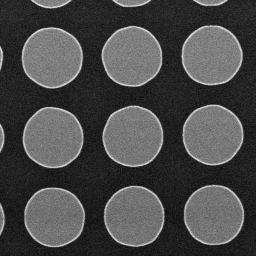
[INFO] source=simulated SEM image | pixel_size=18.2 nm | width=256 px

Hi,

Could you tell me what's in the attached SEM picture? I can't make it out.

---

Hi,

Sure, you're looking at an array of small figures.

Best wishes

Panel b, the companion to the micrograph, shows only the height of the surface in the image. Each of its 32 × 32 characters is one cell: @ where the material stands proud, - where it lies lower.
-----@@@-------@@@-------@@@----
--------------------------------
--------------------------------
------@---------@@-------@@@----
----@@@@@-----@@@@@-----@@@@@---
---@@@@@@@---@@@@@@@---@@@@@@@--
---@@@@@@@---@@@@@@@---@@@@@@@--
---@@@@@@@---@@@@@@@---@@@@@@@--
---@@@@@@@---@@@@@@@---@@@@@@@--
----@@@@@-----@@@@@-----@@@@@---
-----@@@-------@@@-------@@-----
--------------------------------
--------------------------------
------@---------@@-------@@@----
----@@@@@-----@@@@@-----@@@@@---
---@@@@@@@---@@@@@@@---@@@@@@@--
---@@@@@@@---@@@@@@@---@@@@@@@--
---@@@@@@@---@@@@@@@---@@@@@@@--
---@@@@@@@---@@@@@@@---@@@@@@@--
----@@@@@@----@@@@@-----@@@@@---
-----@@@-------@@@--------@-----
--------------------------------
--------------------------------
----------------@@-------@@@----
----@@@@@-----@@@@@@----@@@@@@--
---@@@@@@@---@@@@@@@---@@@@@@@--
---@@@@@@@@--@@@@@@@---@@@@@@@--
---@@@@@@@@--@@@@@@@---@@@@@@@--
---@@@@@@@---@@@@@@@---@@@@@@@--
----@@@@@@----@@@@@@----@@@@@---
-----@@@-------@@@--------@@----
--------------------------------